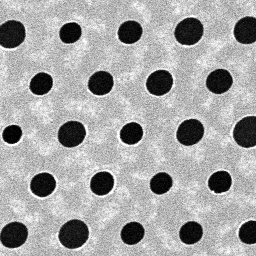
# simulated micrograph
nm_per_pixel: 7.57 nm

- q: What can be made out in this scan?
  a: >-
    a regular array of holes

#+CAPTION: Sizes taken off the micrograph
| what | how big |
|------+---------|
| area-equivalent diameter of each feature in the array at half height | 183 nanometres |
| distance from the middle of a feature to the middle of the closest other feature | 0.439 microns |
